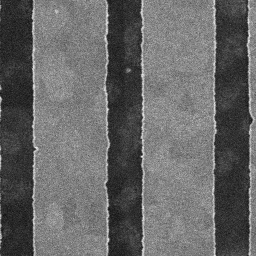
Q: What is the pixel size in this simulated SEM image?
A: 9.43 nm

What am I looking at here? one or a few lines or trenches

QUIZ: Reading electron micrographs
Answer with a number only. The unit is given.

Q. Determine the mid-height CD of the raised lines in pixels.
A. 72.8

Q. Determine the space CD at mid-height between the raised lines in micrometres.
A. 0.326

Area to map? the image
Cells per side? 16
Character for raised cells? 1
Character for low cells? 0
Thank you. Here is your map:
0011111001111000
0011111001111000
0011111001111000
0011111001111000
0011111001111000
0011111001111000
0011111001111000
0011111001111000
0011111001111000
0011111001111000
0011111001111000
0011111001111000
0011111001111000
0011111001111000
0011111001111000
0011111001111000